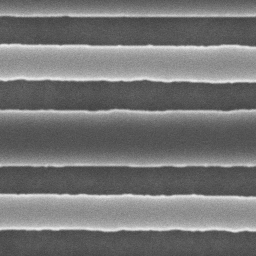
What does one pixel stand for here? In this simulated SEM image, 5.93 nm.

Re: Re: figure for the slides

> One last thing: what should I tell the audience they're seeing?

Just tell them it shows lines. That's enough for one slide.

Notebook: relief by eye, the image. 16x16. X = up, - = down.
XXXXXXXXXXXXXXXX
----------------
----------------
XXXXXXXXXXXXXXXX
XXXXXXXXXXXXXXXX
----------------
----------------
XXXXXXXXXXXXXXXX
XXXXXXXXXXXXXXXX
XXXXXXXXXXXXXXXX
----------------
----------------
XXXXXXXXXXXXXXXX
XXXXXXXXXXXXXXXX
----------------
----------------